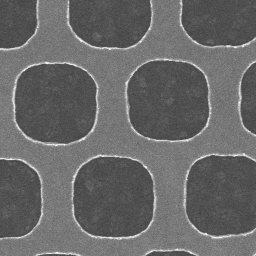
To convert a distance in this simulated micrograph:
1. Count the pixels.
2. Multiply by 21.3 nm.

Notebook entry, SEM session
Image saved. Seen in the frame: holes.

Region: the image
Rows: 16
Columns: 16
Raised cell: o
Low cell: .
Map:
..oo.....oo.....
..oo.....oo.....
..ooo....ooo....
oooooooooooooooo
oo...ooo.....oo.
o.....oo.....oo.
o.....oo.....oo.
o.....oo.....oo.
oo...oooo...oooo
oooooooooooooooo
..ooo....ooo....
...oo.....oo....
...oo.....oo....
...oo.....oo....
..ooo....oooo..o
oooooooooooooooo